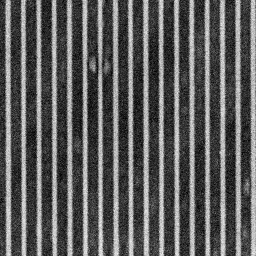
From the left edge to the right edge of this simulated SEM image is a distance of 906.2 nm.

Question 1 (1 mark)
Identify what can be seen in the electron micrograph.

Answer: parallel lines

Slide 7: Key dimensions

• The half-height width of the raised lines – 0.0128 microns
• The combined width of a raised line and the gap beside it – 15.3 px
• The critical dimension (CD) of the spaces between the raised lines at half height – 0.0407 um